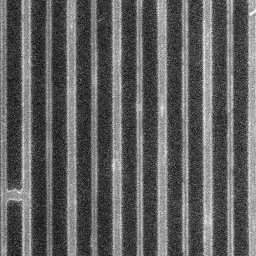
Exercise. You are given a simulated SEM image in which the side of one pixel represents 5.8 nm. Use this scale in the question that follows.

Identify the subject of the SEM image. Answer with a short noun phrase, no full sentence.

parallel lines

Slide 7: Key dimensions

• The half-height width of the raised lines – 104 nm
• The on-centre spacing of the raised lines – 22.6 px